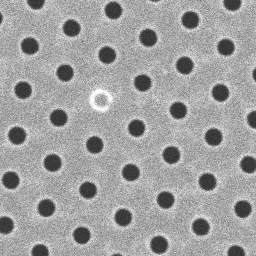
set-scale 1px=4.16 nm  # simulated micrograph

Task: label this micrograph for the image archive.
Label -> a regular array of holes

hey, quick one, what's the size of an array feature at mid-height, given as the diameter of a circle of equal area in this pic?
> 73.7 nm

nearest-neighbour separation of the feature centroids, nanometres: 186